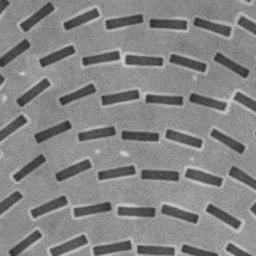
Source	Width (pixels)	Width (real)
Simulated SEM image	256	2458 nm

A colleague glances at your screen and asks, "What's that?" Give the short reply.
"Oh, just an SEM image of an array of small figures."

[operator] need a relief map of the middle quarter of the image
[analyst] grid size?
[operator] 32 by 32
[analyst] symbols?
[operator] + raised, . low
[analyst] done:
+++++.+++++++++..........++++...
++++++++++++++++++++++++++++++++
++++++++++++++++++++++++++++++++
++++++++++++++++++++++++++++++++
++++++++++++++++++++++++++++++++
+++++...++++++++++++++++++++++++
+++.....++++++++...+++++++++++++
+......+++++.......+...+++++++++
.....++++..........+..........+.
..+++++++.......++++..........+.
++++++++++.++++++++++++++++..+++
++++++++++++++++++++++++++++++++
++++++++++++++++++++++++++++++++
++++++++++++++++++++++++++++++++
.+++++++++++++++++++++++++++++++
..+++++++++.++++++++++++++++++++
.+++++.......+++++++++++++.+++++
+++..........+..........+......+
++++......++++..........+.......
+++++++++++++++++++++..+++++....
+++++++++++++++++++++++++++++++.
++++++++++++++++++++++++++++++++
++++++++++++++++++++++++++++++++
++++++++++++++++++++++++++++++++
++++...+++++++++++++++++++++++++
+......++++++++...++++++++++++++
......++++........+.......++++..
....++++..........+..........+..
.+++++++......+++++..........++.
++++++++++++++++++++++++++++++++
++++++++++++++++++++++++++++++++
++++++++++++++++++++++++++++++++